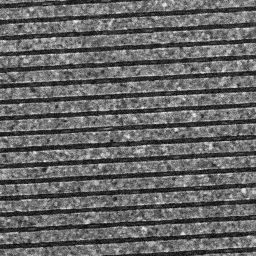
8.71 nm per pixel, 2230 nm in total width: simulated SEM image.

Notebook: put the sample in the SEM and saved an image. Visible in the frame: parallel lines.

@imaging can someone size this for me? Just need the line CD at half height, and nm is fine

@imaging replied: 93.5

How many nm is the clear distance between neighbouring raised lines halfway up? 46.8